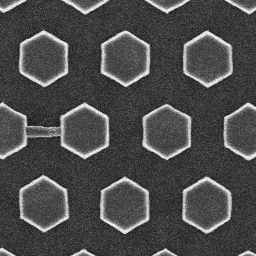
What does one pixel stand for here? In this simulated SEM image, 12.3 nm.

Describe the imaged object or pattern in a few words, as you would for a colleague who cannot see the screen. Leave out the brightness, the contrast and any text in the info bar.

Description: raised bodies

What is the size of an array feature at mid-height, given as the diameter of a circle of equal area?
610 nm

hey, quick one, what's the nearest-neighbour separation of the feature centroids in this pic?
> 1000 nm